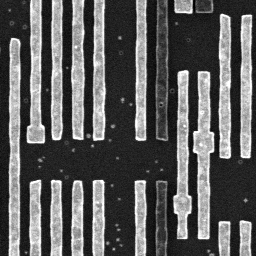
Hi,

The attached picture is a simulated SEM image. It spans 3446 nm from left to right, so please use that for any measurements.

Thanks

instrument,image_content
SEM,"wiring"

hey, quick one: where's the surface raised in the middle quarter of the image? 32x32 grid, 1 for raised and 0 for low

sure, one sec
00111001110000000011000111000000
00111001110000000011000111000000
00111001110000000011000111000110
00111001110000000011000111000110
00111001110000000011000111000110
00111001110000000011000111000110
00111001110000000011000111000110
00111001110000000011000111000110
00111001110000000011000111000110
00111001110000000011000111000110
00111001110000000011000111000110
00111001110000000011000111000110
00111001110000000011000111000110
00111001110000000011000111000110
00111001110000000011000111001110
00111001110000000011000111001110
00111001110000000011000111001110
00111001110000000011000111001110
00111001110000000011000111001110
00000000000000000000000000001110
00000000000000000000000000001110
00000000000000000000000000001110
00000000000000000000000000001110
00000000000000000000000000001110
00000000000000000000000000001110
00000000000000000000000000000110
00000000000000000000000000000110
00000000000000000000000000000110
00000000000000000000000000001110
00010001110000000011000110001110
00110001110000000011000111001110
00111001110000000011000111001110